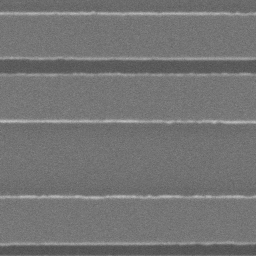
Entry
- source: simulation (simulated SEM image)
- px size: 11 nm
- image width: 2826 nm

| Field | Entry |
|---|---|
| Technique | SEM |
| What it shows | lines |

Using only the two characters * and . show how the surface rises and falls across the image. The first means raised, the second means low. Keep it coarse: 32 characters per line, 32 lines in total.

................................
................................
********************************
********************************
********************************
********************************
********************************
................................
................................
********************************
********************************
********************************
********************************
********************************
********************************
................................
................................
................................
................................
................................
................................
................................
................................
................................
................................
********************************
********************************
********************************
********************************
********************************
***********************..**..*..
................................